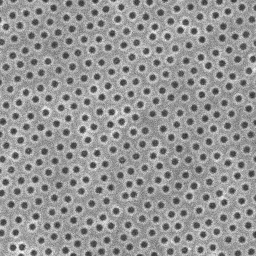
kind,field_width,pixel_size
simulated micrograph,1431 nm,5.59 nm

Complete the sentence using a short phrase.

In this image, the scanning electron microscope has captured a regular array of holes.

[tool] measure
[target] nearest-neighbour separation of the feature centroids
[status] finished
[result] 69.9 nm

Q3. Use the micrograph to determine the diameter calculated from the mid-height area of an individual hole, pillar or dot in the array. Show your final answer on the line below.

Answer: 39.9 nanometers